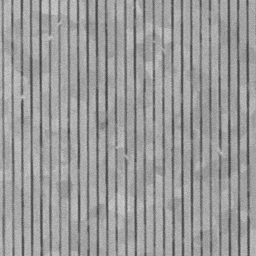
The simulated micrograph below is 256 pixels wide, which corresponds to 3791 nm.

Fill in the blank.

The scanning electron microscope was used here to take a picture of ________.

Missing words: parallel lines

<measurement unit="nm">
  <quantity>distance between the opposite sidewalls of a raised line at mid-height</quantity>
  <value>96.3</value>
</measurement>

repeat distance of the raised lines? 139 nanometers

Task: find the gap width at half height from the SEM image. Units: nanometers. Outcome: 40.7